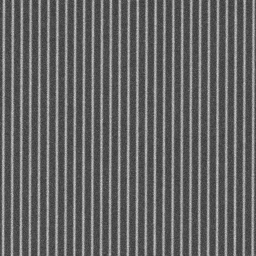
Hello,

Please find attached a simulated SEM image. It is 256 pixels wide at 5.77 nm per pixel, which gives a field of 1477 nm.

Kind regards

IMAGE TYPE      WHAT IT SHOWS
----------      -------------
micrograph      parallel lines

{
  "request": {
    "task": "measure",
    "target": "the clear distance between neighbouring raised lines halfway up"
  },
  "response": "41.1 nanometers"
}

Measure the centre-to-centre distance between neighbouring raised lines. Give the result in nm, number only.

51.4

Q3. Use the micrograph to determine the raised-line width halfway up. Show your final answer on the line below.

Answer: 8.6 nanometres